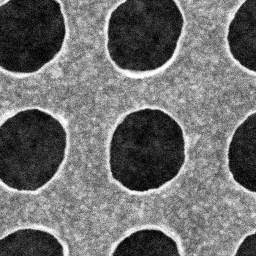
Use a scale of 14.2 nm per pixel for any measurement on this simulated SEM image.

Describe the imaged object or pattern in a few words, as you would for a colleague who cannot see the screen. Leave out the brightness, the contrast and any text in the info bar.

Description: holes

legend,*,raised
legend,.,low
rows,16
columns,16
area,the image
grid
....***....****.
....***....***..
....***....***..
...****....****.
*.******.*******
****************
****************
....****...****.
....***....****.
....***.....**..
....***....***..
...*****..*****.
****************
****************
*..*****..******
....***....****.